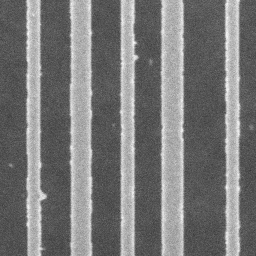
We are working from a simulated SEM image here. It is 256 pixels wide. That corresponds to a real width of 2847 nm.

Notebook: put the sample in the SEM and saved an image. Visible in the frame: lines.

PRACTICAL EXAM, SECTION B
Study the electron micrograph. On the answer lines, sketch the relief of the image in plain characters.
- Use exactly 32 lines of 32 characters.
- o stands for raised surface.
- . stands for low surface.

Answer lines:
...oo....oo....oo...ooo.....oo..
...oo....oo....oo...ooo.....oo..
...oo....oo....oo...ooo.....oo..
...oo....oo....oo...ooo.....oo..
...oo....oo....oo...ooo.....oo..
...oo....oo....oo...ooo.....oo..
...oo....oo....oo...ooo.....oo..
...oo....oo....oo...ooo.....oo..
....o....oo....oo...ooo.....oo..
...oo....oo....oo...ooo.....oo..
...oo....oo....oo...ooo.....oo..
....o....oo....oo...ooo.....oo..
...oo....oo....oo...ooo.....oo..
...oo....oo....oo...ooo.....oo..
...oo....oo....oo...ooo.....oo..
...oo....oo....oo...ooo.....oo..
...oo....oo....oo...ooo.....oo..
...oo....oo....oo...ooo.....oo..
...oo....oo....oo...ooo.....oo..
...oo....oo....oo...ooo.....oo..
....o....oo....oo...ooo.....oo..
....o....oo....oo...ooo.....oo..
...oo....oo....oo...ooo.....oo..
...oo....oo....oo...ooo.....oo..
...oo....oo....oo...ooo.....oo..
...oo....oo....oo...ooo.....oo..
...oo....oo....oo...ooo.....oo..
...oo....oo....oo...ooo.....oo..
...oo....oo....oo...ooo.....oo..
....o....oo....oo...ooo.....oo..
....o....oo....oo...ooo.....oo..
....o....oo....oo...ooo.....oo..